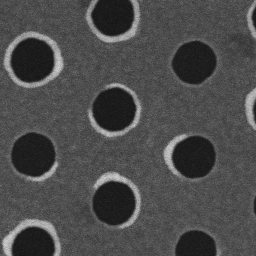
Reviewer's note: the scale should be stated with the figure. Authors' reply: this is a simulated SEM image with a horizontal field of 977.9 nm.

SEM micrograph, holes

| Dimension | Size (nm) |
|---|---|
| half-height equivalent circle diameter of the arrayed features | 168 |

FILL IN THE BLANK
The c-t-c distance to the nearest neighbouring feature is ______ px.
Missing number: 92.9